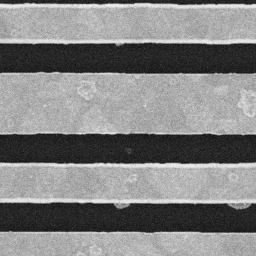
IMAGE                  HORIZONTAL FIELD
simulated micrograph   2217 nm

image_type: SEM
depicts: lines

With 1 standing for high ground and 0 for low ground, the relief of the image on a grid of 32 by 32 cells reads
00000000000000000000000000000000
11111111111111111111111111111111
11111111111111111111111111111111
11111111111111111111111111111111
11111111111111111111111111111111
00000000000000000000000000000000
00000000000000000000000000000000
00000000000000000000000000000000
00000000000000000000000000000000
11111111111111111111111111111111
11111111111111111111111111111111
11111111111111111111111111111111
11111111111111111111111111111111
11111111111111111111111111111111
11111111111111111111111111111111
11111111111111111111111111111111
11111111111111111111111111111111
00000000000000000000000000000000
00000000000000000000000000000000
00000000000000000000000000000000
00000000000000000000000000000000
11111111111111111111111111111111
11111111111111111111111111111111
11111111111111111111111111111111
11111111111111111111111111111111
00000000000000000000000000000000
00000000000000000000000000000000
00000000000000000000000000000000
00000000000000000000000000000000
11111111111111111111111111111111
11111111111111111111111111111111
11111111111111111111111111111111